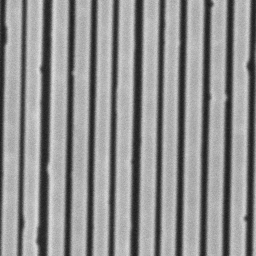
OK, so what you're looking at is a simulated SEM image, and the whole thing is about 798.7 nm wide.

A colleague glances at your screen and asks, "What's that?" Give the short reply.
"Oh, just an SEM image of parallel lines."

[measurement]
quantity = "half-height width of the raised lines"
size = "45.3 nanometers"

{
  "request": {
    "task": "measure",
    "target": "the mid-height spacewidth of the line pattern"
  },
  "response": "25.4 nanometers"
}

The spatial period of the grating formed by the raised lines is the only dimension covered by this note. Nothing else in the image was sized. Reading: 0.0712 um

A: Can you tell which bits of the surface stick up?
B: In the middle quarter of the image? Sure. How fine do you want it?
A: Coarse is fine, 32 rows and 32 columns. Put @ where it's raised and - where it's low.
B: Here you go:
@--@@@--@@@@--@@@---@@@--@@@---@
@--@@@--@@@@--@@@---@@@--@@@---@
@-@@@@--@@@@--@@@---@@@--@@@---@
@--@@@--@@@@--@@@---@@@--@@@---@
@--@@@--@@@@--@@@---@@@--@@@---@
@--@@@--@@@@-@@@@---@@@--@@@---@
@--@@@--@@@@-@@@@---@@@--@@@---@
@--@@@--@@@@-@@@@---@@@--@@@---@
@--@@@--@@@--@@@@---@@@--@@@---@
@--@@@--@@@--@@@@---@@@--@@@---@
@--@@@--@@@--@@@@---@@@--@@@---@
@--@@@--@@@--@@@@---@@@--@@@--@@
---@@@--@@@--@@@@---@@@--@@@--@@
---@@@--@@@--@@@@---@@@--@@@--@@
--@@@@--@@@--@@@@---@@@--@@@--@@
--@@@@--@@@--@@@@---@@@--@@@--@@
--@@@@--@@@--@@@@---@@@--@@@--@@
--@@@@--@@@--@@@@---@@@--@@@--@@
--@@@@--@@@--@@@@---@@@--@@@--@@
--@@@@--@@@--@@@@---@@@--@@@--@@
--@@@@--@@@--@@@@---@@@--@@@--@@
--@@@@--@@@--@@@@--@@@@--@@@--@@
--@@@@--@@@--@@@@--@@@@--@@@--@@
--@@@@--@@@--@@@@--@@@@--@@@--@@
--@@@@--@@@--@@@---@@@@--@@@--@@
--@@@@--@@@--@@@@--@@@@--@@@--@@
--@@@@--@@@--@@@@--@@@@--@@@--@@
--@@@@--@@@--@@@@--@@@@--@@@--@@
--@@@@--@@@--@@@@--@@@@--@@@--@@
--@@@@--@@@--@@@@--@@@@--@@@--@@
--@@@@--@@@--@@@@--@@@@--@@@--@@
--@@@@--@@@--@@@@--@@@@--@@@--@@